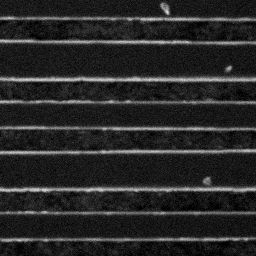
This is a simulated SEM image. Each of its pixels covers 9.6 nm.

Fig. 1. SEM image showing lines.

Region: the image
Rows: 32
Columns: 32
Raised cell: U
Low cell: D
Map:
UUUUUUUUUUUUUUUUUUUUUUUUUUUUUUUU
UUUUUUUUUUUUUUUUUUUUUUUUUUUUUUUU
DDDDDDDDDDDDDDDDDDDDDDDDDDDDDDDD
DDDDDDDDDDDDDDDDDDDDDDDDDDDDDDDD
DDDDDDDDDDDDDDDDDDDDDDDDDDDDDDDD
UUUUUUUUUUUUUUUUUUUUUUUUUUUUUUUU
UUUUUUUUUUUUUUUUUUUUUUUUUUUUUUUU
UUUUUUUUUUUUUUUUUUUUUUUUUUUUUUUU
UUUUUUUUUUUUUUUUUUUUUUUUUUUUUUUU
UUUUUUUUUUUUUUUUUUUUUUUUUUUUUUUU
DDDDDDDDDDDDDDDDDDDDDDDDDDDDDDDD
DDDDDDDDDDDDDDDDDDDDDDDDDDDDDDDD
DDDDDDDDDDDDDDDDDDDDDDDDDDDDDDDD
UUUUUUUUUUUUUUUUUUUUUUUUUUUUUUUU
UUUUUUUUUUUUUUUUUUUUUUUUUUUUUUUU
UUUUUUUUUUUUUUUUUUUUUUUUUUUUUUUU
DDDDDDDDDDDDDDDDDDDDDDDDDDDDDDDD
DDDDDDDDDDDDDDDDDDDDDDDDDDDDDDDD
DDDDDDDDDDDDDDDDDDDDDDDDDDDDDDDD
UUUUUUUUUUUUUUUUUUUUUUUUUUUUUUUU
UUUUUUUUUUUUUUUUUUUUUUUUUUUUUUUU
UUUUUUUUUUUUUUUUUUUUUUUUUUUUUUUU
UUUUUUUUUUUUUUUUUUUUUUUUUUUUUUUU
UUUUUUUUUUUUUUUUUUUUUUUUUUUUUUUU
DDDDDDDDDDDDDDDDDDDDDDDDDDDDDDDD
DDDDDDDDDDDDDDDDDDDDDDDDDDDDDDDD
UDUUUUDDDDDDDDDDDDDDDDDDDDDDDDDD
UUUUUUUUUUUUUUUUUUUUUUUUUUUUUUUU
UUUUUUUUUUUUUUUUUUUUUUUUUUUUUUUU
UUUUUUUUUUUUUUUUUUUUUUUUUUUUUUUU
DDDDDDDDDDDDDDDDDDDDDDDDDDDDDDDD
DDDDDDDDDDDDDDDDDDDDDDDDDDDDDDDD